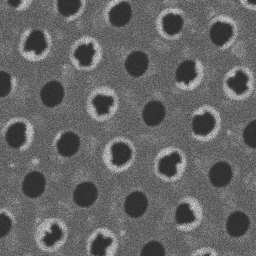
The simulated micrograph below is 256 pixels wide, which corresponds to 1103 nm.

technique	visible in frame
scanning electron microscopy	a regular array of holes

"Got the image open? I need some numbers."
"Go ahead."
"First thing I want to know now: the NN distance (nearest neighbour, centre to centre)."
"220 nm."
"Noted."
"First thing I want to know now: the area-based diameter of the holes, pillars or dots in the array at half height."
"101 nanometres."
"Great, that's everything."